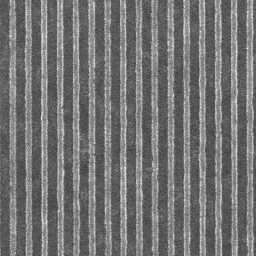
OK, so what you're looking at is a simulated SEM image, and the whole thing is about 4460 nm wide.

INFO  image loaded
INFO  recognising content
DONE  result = parallel lines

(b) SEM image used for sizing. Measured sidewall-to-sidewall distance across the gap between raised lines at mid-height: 0.192 micrometres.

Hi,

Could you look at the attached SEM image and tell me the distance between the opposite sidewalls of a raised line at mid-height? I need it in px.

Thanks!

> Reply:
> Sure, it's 5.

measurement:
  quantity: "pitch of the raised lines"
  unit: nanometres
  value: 275